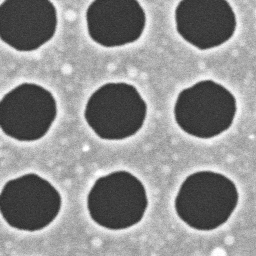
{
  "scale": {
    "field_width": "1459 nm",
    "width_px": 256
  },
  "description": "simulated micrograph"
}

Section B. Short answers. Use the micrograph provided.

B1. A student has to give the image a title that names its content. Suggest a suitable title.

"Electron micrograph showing holes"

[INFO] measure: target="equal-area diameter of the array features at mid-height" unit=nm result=342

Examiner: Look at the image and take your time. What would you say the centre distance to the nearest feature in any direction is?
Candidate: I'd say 509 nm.